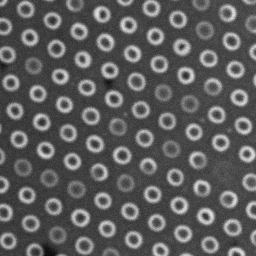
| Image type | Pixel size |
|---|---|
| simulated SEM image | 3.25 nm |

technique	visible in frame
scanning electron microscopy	a regular array of raised bodies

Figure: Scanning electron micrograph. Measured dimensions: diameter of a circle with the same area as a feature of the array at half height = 54.2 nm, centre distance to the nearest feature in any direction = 28.3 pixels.